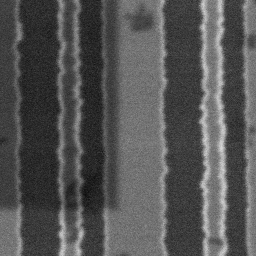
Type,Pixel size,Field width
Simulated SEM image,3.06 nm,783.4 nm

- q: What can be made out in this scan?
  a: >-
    lines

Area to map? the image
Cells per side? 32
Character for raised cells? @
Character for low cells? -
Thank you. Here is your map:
@@-----@@@---@@@@@@@-----@@@---@
@@-----@@@---@@@@@@@-----@@@--@@
@@-----@@@---@@@@@@@-----@@@---@
@@-----@@@---@@@@@@@-----@@@---@
@@-----@@@---@@@@@@@-----@@@---@
@@------@@---@@@@@@@------@----@
@@------@@---@@@@@@@@----@@@--@@
@@-----@@@---@@@@@@@-----@@@---@
@@------@@---@@@@@@@-----@@@---@
@@-----@@@---@@@@@@@@-----@@---@
@@-----@@@---@@@@@@@@----@@@---@
@@-----@@@---@@@@@@@------@@---@
@@-----@@@---@@@@@@@-----@@@---@
@@------@@---@@@@@@@-----@@@---@
@@------@@---@@@@@@@-----@@@---@
@@-----@@@---@@@@@@@@----@@@---@
@@------@@---@@@@@@@-----@@@---@
@@------@@---@@@@@@@@-----@@---@
@@-----@@@---@@@@@@@@-----@@---@
@@-----@@@---@@@@@@@@-----@@---@
@@------@@---@@@@@@@@-----@@---@
@@------@@---@@@@@@@@-----@@---@
@@-----@@@---@@@@@@@-----@@@---@
@@------@@---@@@@@@@@----@@@---@
@@@-----@@---@@@@@@@------@@---@
@@------@@---@@@@@@@@-----@@---@
@@------@@---@@@@@@@@-----@@---@
@@------@@---@@@@@@@@-----@@---@
@@------@@---@@@@@@@@-----@@---@
@@------@@---@@@@@@@@-----@@---@
@@@-----@@---@@@@@@@@-----@@---@
@@------@@---@@@@@@@@-----@@---@